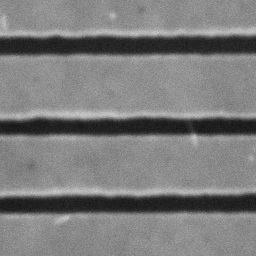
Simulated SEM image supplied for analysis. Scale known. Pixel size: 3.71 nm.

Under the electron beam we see lines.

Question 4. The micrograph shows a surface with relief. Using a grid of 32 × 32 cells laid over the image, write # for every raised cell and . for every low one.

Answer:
################################
################################
################################
################################
##..##.####.....................
................................
................................
################################
################################
################################
################################
################################
################################
################################
################################
................................
................................
################################
################################
################################
################################
################################
################################
################################
#...##.......#..##..............
................................
................................
################################
################################
################################
################################
################################